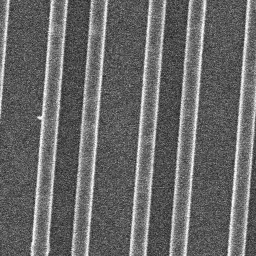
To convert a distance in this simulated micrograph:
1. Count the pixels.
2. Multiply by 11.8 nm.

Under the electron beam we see parallel lines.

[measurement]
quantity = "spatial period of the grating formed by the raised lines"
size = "565 nm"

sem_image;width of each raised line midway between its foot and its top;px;15.1